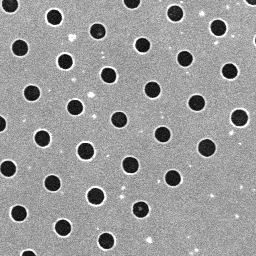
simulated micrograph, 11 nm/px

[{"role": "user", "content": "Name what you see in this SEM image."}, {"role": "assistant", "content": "a regular array of holes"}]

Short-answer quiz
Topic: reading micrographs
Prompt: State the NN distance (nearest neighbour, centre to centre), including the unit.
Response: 44.9 pixels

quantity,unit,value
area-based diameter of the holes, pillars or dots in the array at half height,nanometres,181